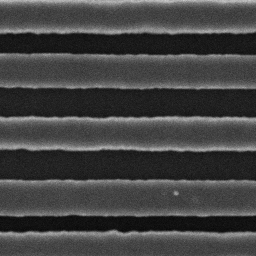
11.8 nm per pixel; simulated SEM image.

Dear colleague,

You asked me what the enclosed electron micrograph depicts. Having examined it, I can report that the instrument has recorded lines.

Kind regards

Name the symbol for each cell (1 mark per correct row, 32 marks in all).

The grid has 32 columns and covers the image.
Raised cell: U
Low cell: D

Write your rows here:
UUUUUUUUUUUUUUUUUUUUUUUUUUUUUUUU
UUUUUUUUUUUUUUUUUUUUUUUUUUUUUUUU
UUUUUUUUUUUUUUUUUUUUUUUUUUUUUUUU
UUUUUUUUUUUUUUUUUUUUUUUUUUUUUUUU
DDDDDDDDDDDDDDDDDDDDDDDDDDDDDDDD
DDDDDDDDDDDDDDDDDDDDDDDDDDDDDDDD
DDDDDDDDDDDDDDDDDDDDDDDDDDDDDDDD
UUUUUUUUUUUUUUUUUUUUUUUUUUUUUUUU
UUUUUUUUUUUUUUUUUUUUUUUUUUUUUUUU
UUUUUUUUUUUUUUUUUUUUUUUUUUUUUUUU
UUUUUUUUUUUUUUUUUUUUUUUUUUUUUUUU
DDDDDDDDDDDDDDDDDDDDDDDDDDDDDDDD
DDDDDDDDDDDDDDDDDDDDDDDDDDDDDDDD
DDDDDDDDDDDDDDDDDDDDDDDDDDDDDDDD
DDDDDDDDDDDDDDDDDDDDDDDDDDDDDDDD
UUUUUUUUUUUUUUUUUUUUUUUUUUUUUUUU
UUUUUUUUUUUUUUUUUUUUUUUUUUUUUUUU
UUUUUUUUUUUUUUUUUUUUUUUUUUUUUUUU
UUUUUUUUUUUUUUUUUUUUUUUUUUUUUUUU
DDDDDDDDDDDDDDDDDDDDDDDDDDDDDDDD
DDDDDDDDDDDDDDDDDDDDDDDDDDDDDDDD
DDDDDDDDDDDDDDDDDDDDDDDDDDDDDDDD
DDDDDDDDDDDDDDUDDDDDDDDDDDDDDDDD
UUUUUUUUUUUUUUUUUUUUUUUUUUUUUUUU
UUUUUUUUUUUUUUUUUUUUUUUUUUUUUUUU
UUUUUUUUUUUUUUUUUUUUUUUUUUUUUUUU
UUUUUUUUUUUUUUUUUUUUUUUUUUUUUUUU
DDDDDDDDDDDDDDDDDDDDDDDDDDDDDDDD
DDDDDDDDDDDDDDDDDDDDDDDDDDDDDDDD
UUUUUUUUUUUUUUUUUUUUUUUUUUUUUUUU
UUUUUUUUUUUUUUUUUUUUUUUUUUUUUUUU
UUUUUUUUUUUUUUUUUUUUUUUUUUUUUUUU